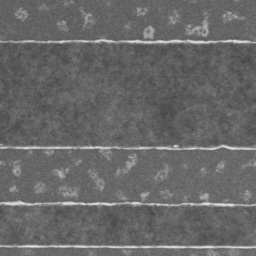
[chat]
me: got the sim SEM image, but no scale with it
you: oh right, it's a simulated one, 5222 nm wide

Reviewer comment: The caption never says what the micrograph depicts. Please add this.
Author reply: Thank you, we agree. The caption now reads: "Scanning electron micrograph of one or a few lines or trenches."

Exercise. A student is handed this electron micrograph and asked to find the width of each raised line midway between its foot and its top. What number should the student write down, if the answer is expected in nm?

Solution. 1150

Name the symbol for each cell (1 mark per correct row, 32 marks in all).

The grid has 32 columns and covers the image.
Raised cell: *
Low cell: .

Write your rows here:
********************************
********************************
********************************
********************************
********************************
................................
................................
................................
................................
................................
................................
................................
................................
................................
................................
................................
................................
................................
**.**..******.*............**...
********************************
********************************
********************************
********************************
********************************
********************************
...***....*****...*****.*..*****
................................
................................
................................
................................
................................
********************************